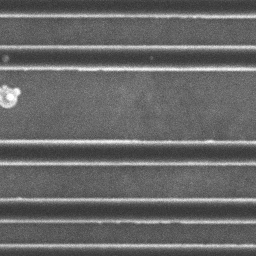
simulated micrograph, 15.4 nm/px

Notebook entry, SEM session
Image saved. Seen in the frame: lines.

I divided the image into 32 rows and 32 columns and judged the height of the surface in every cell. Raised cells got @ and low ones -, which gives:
@@@@@@@@@@@@@@@@@@@@@@@@@@@@@@@@
@@@@@@@@@@@@@@@@@@@@@@@@@@@@@@@@
--------------------------------
--------------------------------
--------------------------------
--------------------------------
@@@@@@@@@@@@@@@@@@@@@@@@@@@@@@@@
@@@@@@@@@@@@@@@@@@@@@@@@@@@@@@@@
@@@@@@@@@@@@@@@@@@@@@@@@@@@@@@@@
--------------------------------
--------------------------------
--------------------------------
--------------------------------
--------------------------------
--------------------------------
--------------------------------
--------------------------------
--------------------------------
@@@@@@@@@@@@@@@@@@@@@@@@@@@@@@@@
@@@@@@@@@@@@@@@@@@@@@@@@@@@@@@@@
@@@@@@@@@@@@@@@@@@@@@@@@@@@@@@@@
--------------------------------
--------------------------------
--------------------------------
--------------------------------
@@@@@@@@@@@@@@@@@@@@@@@@@@@@@@@@
@@@@@@@@@@@@@@@@@@@@@@@@@@@@@@@@
@@@@@@@@@@@@@@@@@@@@@@@@@@@@@@@@
--------------------------------
--------------------------------
--------------------------------
@@@@@@@@@@@@@@@@@@@@@@@@@@@@@@@@